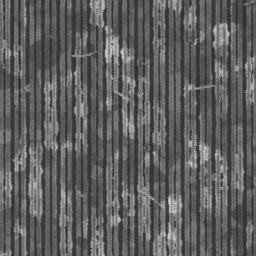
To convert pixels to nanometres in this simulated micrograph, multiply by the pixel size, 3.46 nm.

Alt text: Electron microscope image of parallel lines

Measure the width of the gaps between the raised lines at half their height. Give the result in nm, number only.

9.5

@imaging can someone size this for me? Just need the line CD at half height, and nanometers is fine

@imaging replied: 15.6